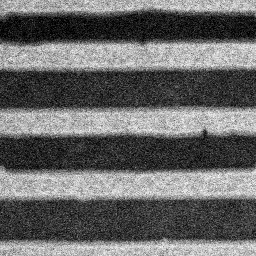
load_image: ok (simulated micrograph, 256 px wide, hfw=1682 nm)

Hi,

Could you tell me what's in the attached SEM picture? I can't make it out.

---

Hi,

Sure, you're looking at one or a few lines or trenches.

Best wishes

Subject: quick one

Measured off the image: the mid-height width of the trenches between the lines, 0.281 micrometres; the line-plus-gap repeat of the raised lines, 0.424 um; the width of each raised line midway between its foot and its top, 23.5 pixels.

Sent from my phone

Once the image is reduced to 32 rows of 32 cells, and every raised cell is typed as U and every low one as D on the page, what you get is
UUUUUUUUUUUUUUUUUUUUUUUUUUUUUUUU
UUUUUUUUDUUUUUUDDDDDDDDDDDDDDDDU
DDDDDDDDDDDDDDDDDDDDDDDDDDDDDDDD
DDDDDDDDDDDDDDDDDDDDDDDDDDDDDDDD
DDDDDDDDDDDDDDDDDDDDDDDDDDDDDDDD
DDDDDUUUUUUUUUUUUDUUUUUUUUUUUUUU
UUUUUUUUUUUUUUUUUUUUUUUUUUUUUUUU
UUUUUUUUUUUUUUUUUUUUUUUUUUUUUUUU
UUUDUUDDDDDDDDDDDDDDDDDDDDDDDDDD
DDDDDDDDDDDDDDDDDDDDDDDDDDDDDDDD
DDDDDDDDDDDDDDDDDDDDDDDDDDDDDDDD
DDDDDDDDDDDDDDDDDDDDDDDDDDDDDDDD
DDDDDDDDDDDDDDDDDDDDDDDDDDDDDDDD
DDDDDDDDDDDDDDDDDDDDDDDDDDDDDDDD
UUUUUUUUUUUUUUUUUUUUUUUUUUUUUUUU
UUUUUUUUUUUUUUUUUUUUUUUUUUUUUUUU
UUUUUUUUUUUUUUUUUUUUUUUUUDUUDDDD
DDDDDDDDDDDDDDDDDDDDDDDDDDDDDDDD
DDDDDDDDDDDDDDDDDDDDDDDDDDDDDDDD
DDDDDDDDDDDDDDDDDDDDDDDDDDDDDDDD
DDDDDDDDDDDDDDDDDDDDDDDDDDDDDDDD
UDDDDDDDDDDDDDDDDDDDDDDDDDDDDDUU
UUUUUUUUUUUUUUUUUUUUUUUUUUUUUUUU
UUUUUUUUUUUUUUUUUUUUUUUUUUUUUUUU
UUUUUUUUUUUUUUUUDDDDDDDDDDDDDDDD
DDDDDDDDDDDDDDDDDDDDDDDDDDDDDDDD
DDDDDDDDDDDDDDDDDDDDDDDDDDDDDDDD
DDDDDDDDDDDDDDDDDDDDDDDDDDDDDDDD
DDDDDDDDDDDDDDDDDDDDDDDDDDDDDDDD
DDDDDDDDDDDDDDDDDDDDDDDDDDDDDDDD
DDDDDDDDDDDDDDDDDDDDUUUDDDDDDDUU
UUUUUUUUUUUUUUUUUUUUUUUUUUUUUUUU